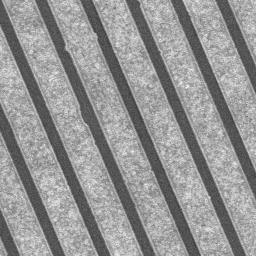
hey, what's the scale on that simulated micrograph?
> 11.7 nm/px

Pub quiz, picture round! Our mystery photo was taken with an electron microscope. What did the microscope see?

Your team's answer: parallel lines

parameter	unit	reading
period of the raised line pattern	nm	488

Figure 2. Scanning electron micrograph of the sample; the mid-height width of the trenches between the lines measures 138 nm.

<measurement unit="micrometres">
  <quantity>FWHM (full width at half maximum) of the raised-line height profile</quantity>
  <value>0.355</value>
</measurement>